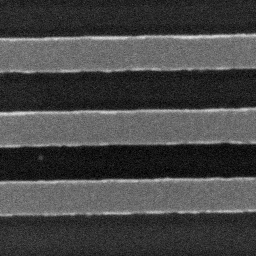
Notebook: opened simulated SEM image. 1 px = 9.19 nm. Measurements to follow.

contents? lines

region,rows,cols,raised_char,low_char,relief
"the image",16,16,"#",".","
................
................
################
################
.#..............
................
................
################
################
................
................
################
################
................
................
................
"